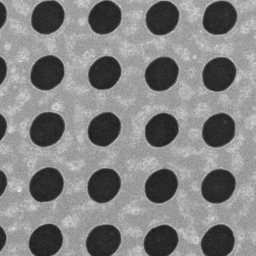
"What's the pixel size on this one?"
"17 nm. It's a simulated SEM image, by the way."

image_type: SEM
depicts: a regular array of holes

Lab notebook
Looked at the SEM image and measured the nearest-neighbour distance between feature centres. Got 955 nm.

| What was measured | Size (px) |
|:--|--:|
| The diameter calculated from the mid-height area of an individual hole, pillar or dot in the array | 34.3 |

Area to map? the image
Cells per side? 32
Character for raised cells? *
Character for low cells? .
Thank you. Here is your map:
*****..*****..*****...****...***
.***....***....***....****....**
.***....***....***....***.....**
****...****....***....****...***
********************************
********************************
********************************
.****...****...****...****...***
.***....***....***....***....***
.***....***....***....***....***
****...****....***....****...***
********************************
********************************
********************************
*****...****...****...****...***
.***....***....***....****...***
.***....***....***....***....***
****...****...****....****...***
********************************
********************************
********************************
*****..*****..*****...****...***
.***....***....***....***....***
.***....***....***....***....***
****...****...****....***....***
********************************
********************************
********************************
*****..*****...****...****...***
.***....***....***....***....***
.***....***....***....***....***
****...****...****....***....***